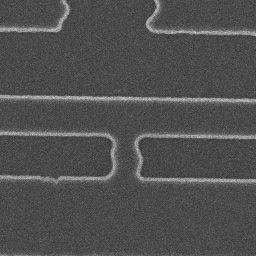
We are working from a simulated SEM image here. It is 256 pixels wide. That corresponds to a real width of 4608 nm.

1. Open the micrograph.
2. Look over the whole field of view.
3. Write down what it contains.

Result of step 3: one or a few lines or trenches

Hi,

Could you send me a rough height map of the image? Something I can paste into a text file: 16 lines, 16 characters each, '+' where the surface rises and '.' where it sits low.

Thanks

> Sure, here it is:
++++......++++++
++++.....+++++++
................
................
................
................
++++++++++++++++
++++++++++++++++
.......++...++++
.......++.......
.......++.......
++++++++++++++++
++++++++++++++++
++++++++++++++++
++++++++++++++++
++++++++++++++++